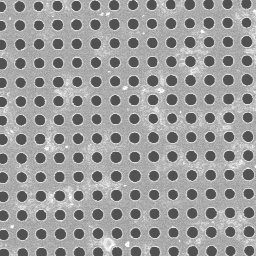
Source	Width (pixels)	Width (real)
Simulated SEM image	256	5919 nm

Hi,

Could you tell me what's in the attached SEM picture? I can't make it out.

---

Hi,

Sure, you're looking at a regular array of holes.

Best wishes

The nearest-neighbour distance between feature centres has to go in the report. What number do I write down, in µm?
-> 0.434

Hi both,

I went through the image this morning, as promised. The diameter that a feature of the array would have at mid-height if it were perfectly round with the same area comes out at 245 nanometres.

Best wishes